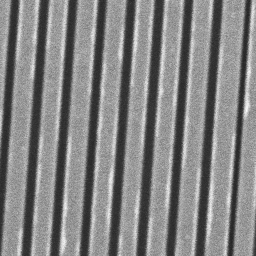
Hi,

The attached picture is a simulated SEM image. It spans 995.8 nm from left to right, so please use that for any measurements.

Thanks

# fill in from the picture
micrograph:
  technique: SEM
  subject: parallel lines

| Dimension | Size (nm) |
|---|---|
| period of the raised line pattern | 113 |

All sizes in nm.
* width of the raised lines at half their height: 81.9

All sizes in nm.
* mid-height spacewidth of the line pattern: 32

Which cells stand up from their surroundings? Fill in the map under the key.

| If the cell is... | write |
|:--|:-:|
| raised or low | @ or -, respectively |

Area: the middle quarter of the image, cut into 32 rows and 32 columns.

--@@@@@---@@@@---@@@@---@@@@@--@
--@@@@@---@@@@---@@@@---@@@@@--@
--@@@@@--@@@@@---@@@@---@@@@@--@
--@@@@@--@@@@@---@@@@---@@@@@--@
--@@@@@--@@@@@--@@@@@---@@@@@--@
--@@@@@--@@@@@--@@@@@---@@@@---@
--@@@@@--@@@@@--@@@@@--@@@@@---@
--@@@@@--@@@@@--@@@@@--@@@@@---@
--@@@@@--@@@@@--@@@@@--@@@@@--@@
--@@@@@--@@@@@--@@@@@--@@@@@--@@
--@@@@@--@@@@@--@@@@@--@@@@@--@@
-@@@@@@--@@@@@--@@@@@--@@@@@--@@
-@@@@@---@@@@@--@@@@@--@@@@@--@@
-@@@@@---@@@@@--@@@@---@@@@@--@@
-@@@@@---@@@@---@@@@---@@@@@--@@
-@@@@@---@@@@---@@@@---@@@@@--@@
-@@@@@--@@@@@---@@@@---@@@@@--@@
-@@@@@--@@@@@---@@@@---@@@@@--@@
-@@@@@--@@@@@--@@@@@---@@@@---@@
-@@@@@--@@@@@--@@@@@---@@@@---@@
-@@@@@--@@@@@--@@@@@--@@@@@---@@
-@@@@@--@@@@@--@@@@@--@@@@@---@@
-@@@@@--@@@@@--@@@@@--@@@@@--@@@
-@@@@@--@@@@@--@@@@@--@@@@@--@@@
@@@@@@--@@@@@--@@@@@--@@@@@--@@@
@@@@@@--@@@@@--@@@@@--@@@@@--@@@
@@@@@---@@@@@--@@@@@--@@@@@--@@@
@@@@@---@@@@@--@@@@---@@@@@--@@@
@@@@@---@@@@---@@@@---@@@@@--@@@
@@@@@---@@@@---@@@@---@@@@@--@@@
@@@@@--@@@@@---@@@@---@@@@@--@@@
@@@@@--@@@@@---@@@@---@@@@@--@@@